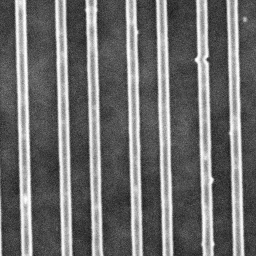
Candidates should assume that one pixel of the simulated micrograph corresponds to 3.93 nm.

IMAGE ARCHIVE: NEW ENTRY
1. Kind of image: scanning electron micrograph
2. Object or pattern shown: parallel lines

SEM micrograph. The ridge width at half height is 33.4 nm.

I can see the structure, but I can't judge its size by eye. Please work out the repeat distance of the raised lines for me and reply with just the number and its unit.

139 nm